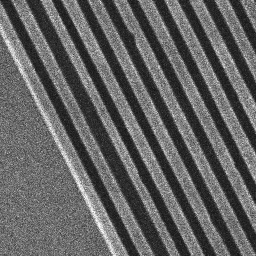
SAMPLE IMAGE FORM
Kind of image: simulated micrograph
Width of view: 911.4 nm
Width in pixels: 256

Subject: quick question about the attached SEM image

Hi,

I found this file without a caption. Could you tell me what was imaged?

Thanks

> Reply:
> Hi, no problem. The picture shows parallel lines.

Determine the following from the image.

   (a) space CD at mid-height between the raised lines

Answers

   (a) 33 nanometres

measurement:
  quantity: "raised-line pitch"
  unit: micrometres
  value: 0.0808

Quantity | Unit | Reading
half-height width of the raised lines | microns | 0.0462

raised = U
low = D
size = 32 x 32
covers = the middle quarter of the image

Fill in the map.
DDUUUDDDUUUDDDUUUUDDUUUUDDDUUUDD
DDDUUUDDUUUUDDDUUUDDDUUUDDDUUUUD
DDDUUUDDDUUUDDDUUUUDDUUUUDDDUUUD
DDDDUUUDDUUUUDDDUUUDDDUUUUDDUUUU
UDDDUUUDDDUUUDDDUUUUDDUUUUDDDUUU
UDDDDUUUDDUUUUDDDUUUDDDUUUUDDUUU
UUDDDUUUDDDUUUDDDUUUUDDDUUUDDDUU
UUDDDDUUUDDUUUUDDDUUUDDDUUUUDDUU
UUUDDDDUUDDDUUUDDDUUUUDDDUUUDDDU
UUUDDDDUUUDDUUUUDDDUUUDDDUUUUDDU
UUUUDDDDUUDDDUUUDDDUUUUDDDUUUDDD
DUUUDDDDUUUDDUUUUDDDUUUDDDUUUUDD
DUUUUDDDDUUDDDUUUDDDUUUUDDDUUUDD
DDUUUDDDDUUUDDUUUUDDDUUUDDDUUUUD
DDUUUUDDDDUUDDDUUUDDDUUUUDDDUUUD
DDDUUUDDDDUUUDDUUUUDDDUUUDDDUUUU
DDDUUUUDDDDUUDDDUUUDDDUUUUDDDUUU
UDDDUUUDDDDUUUDDUUUUDDDUUUDDDUUU
UDDDUUUUDDDDUUDDDUUUDDDUUUUDDDUU
UUDDDUUUDDDDUUUDDUUUUDDDUUUDDDUU
UUDDDUUUUDDDDUUDDDUUUDDDUUUUDDDU
UUUDDDUUUDDDDUUUDDUUUUDDDUUUDDDU
UUUDDDUUUUDDDDUUDDDUUUDDDUUUUDDD
UUUUDDDUUUDDDDUUUDDUUUUDDDUUUDDD
DUUUDDDUUUUDDDDUUDDDUUUDDDUUUUDD
DUUUUDDDUUUDDDDUUUDDUUUUDDDUUUDD
DDUUUDDDUUUUDDDDUUDDDUUUDDDUUUUD
DDUUUUDDDUUUDDDDUUUDDUUUUDDDUUUD
DDDUUUDDDUUUUDDDUUUDDDUUUDDDUUUU
DDDUUUUDDDUUUDDDDUUUDDDUUUDDDUUU
DDDDUUUDDDUUUUDDDDUUDDDUUUDDDUUU
DDDDUUUUDDDUUUDDDDUUUDDDUUUDDDUU